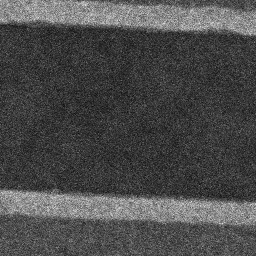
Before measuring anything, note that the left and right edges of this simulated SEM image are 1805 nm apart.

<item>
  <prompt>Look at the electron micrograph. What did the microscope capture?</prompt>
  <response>one or a few lines or trenches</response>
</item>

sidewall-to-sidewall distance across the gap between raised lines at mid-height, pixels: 191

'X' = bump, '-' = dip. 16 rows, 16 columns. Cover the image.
XXXXXXXXXXXXXXXX
---------------X
----------------
----------------
----------------
----------------
----------------
----------------
----------------
----------------
----------------
----------------
----------------
XXXXXXXXXXXXXXXX
XXXXXXXXXXXXXXXX
XXXXXXXXXXXXXXXX